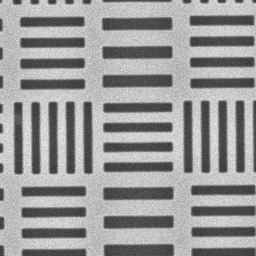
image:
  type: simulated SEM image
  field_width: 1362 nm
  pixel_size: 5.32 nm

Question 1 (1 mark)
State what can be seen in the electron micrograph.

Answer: groups of lines, slits or small figures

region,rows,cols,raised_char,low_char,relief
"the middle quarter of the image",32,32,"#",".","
.....###########################
################################
######################..########
##########.................#####
.....####..................####.
.....#####.................####.
################################
################################
################################
#.###.########################..
...##..###.................###..
...##..###.................###..
...##..#######################..
...##..#######################..
...##..#######################..
...##..###.................###..
...##..###.................###..
...##..#######################..
...##..#######################..
...##..#############.......###..
#..##..###.................###..
#..##..###.................###..
#..##..#######################..
#..##..#######################..
#..##..####................###..
#..##..###.................###..
#..##..###.................###..
#.####.#########################
################################
################################
################################
......####.................#####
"